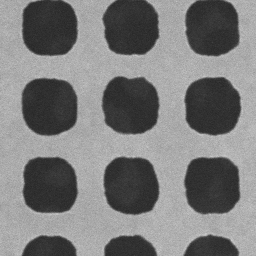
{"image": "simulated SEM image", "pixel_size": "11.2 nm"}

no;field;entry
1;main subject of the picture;holes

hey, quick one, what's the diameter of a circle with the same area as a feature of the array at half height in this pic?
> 674 nm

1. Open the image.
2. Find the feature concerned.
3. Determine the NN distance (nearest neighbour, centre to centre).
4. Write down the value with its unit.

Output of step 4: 888 nm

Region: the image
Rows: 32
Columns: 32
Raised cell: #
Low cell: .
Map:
###......#####.....#####.....###
###......####.......###.......##
###.......###.......###....#..##
###.......###.......###..##...##
###.......###.......###.......##
###......####......#####......##
####.....#####.....#####.....###
################################
################################
################################
###......####....#.#####.....###
###......####....#..###.......##
###.......###.......###.......##
###.......###.......###.......##
###.......###.......###.......##
###......####.......###.......##
####....#######...#######....###
################################
################################
################################
###......#####.....#####.....###
###......####......####.......##
###.......###.......###.......##
###.......###.......###.......##
###.......###.......###.......##
###......####......####.......##
####....#######....#######...###
################################
################################
#####...#######...#######..#####
###......####......#####.....###
###.......###.......###.......##